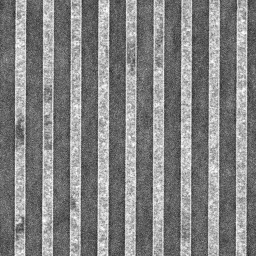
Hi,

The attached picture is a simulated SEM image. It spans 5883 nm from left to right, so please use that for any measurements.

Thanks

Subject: parallel lines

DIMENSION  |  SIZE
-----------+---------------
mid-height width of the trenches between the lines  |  411 nm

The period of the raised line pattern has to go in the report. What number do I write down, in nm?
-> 635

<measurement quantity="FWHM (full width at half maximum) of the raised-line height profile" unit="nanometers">227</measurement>